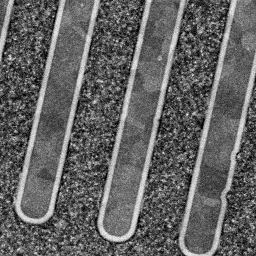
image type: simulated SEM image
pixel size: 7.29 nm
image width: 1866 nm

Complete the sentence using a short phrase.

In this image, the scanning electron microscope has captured one or a few lines or trenches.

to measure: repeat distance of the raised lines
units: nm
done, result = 609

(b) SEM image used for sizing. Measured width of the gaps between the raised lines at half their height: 370 nm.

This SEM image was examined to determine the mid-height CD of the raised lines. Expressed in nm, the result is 243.